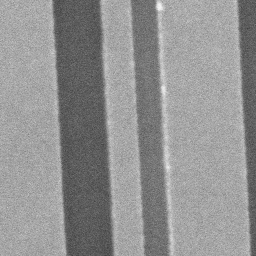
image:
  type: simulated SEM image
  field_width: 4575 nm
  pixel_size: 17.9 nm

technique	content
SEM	lines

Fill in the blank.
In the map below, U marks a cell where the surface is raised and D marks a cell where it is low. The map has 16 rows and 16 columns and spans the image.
UUUDDDUUUUUUUUUD
UUUDDDDUUUUUUUUD
UUUDDDDUUUUUUUUD
UUUDDDDUUUUUUUUD
UUUDDDDUUUUUUUUD
UUUUDDDUUUUUUUUD
UUUUDDDUUUUUUUUD
UUUUDDDUUUUUUUUD
UUUUDDDUUUUUUUUD
UUUUDDDUUUUUUUUD
UUUUDDDUUUUUUUUD
UUUUDDDUUUUUUUUD
UUUUDDDUUUUUUUUD
UUUUDDDUUUUUUUUD
UUUUDDDUUUUUUUUU
UUUUDDDUUUUUUUUU